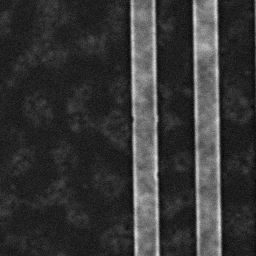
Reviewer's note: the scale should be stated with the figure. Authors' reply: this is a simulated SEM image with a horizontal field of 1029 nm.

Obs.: one or a few lines or trenches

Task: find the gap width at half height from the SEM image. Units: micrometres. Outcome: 0.159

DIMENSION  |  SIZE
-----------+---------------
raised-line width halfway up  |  0.0905 micrometres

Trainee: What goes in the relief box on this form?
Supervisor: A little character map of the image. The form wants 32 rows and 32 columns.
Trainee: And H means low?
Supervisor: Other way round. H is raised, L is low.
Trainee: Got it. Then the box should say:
LLLLLLLLLLLLLLLLLHHLLLLLHHHLLLLL
LLLLLLLLLLLLLLLLLHHLLLLLHHHLLLLL
LLLLLLLLLLLLLLLLLHHLLLLLHHHLLLLL
LLLLLLLLLLLLLLLLLHHLLLLLHHHLLLLL
LLLLLLLLLLLLLLLLLHHLLLLLHHHLLLLL
LLLLLLLLLLLLLLLLLHHLLLLLHHHLLLLL
LLLLLLLLLLLLLLLLLHHLLLLLHHHLLLLL
LLLLLLLLLLLLLLLLLHHLLLLLHHHLLLLL
LLLLLLLLLLLLLLLLLHHLLLLLHHHLLLLL
LLLLLLLLLLLLLLLLLHHLLLLLHHHLLLLL
LLLLLLLLLLLLLLLLLHHLLLLLHHHLLLLL
LLLLLLLLLLLLLLLLLHHLLLLLHHHLLLLL
LLLLLLLLLLLLLLLLLHHLLLLLHHHLLLLL
LLLLLLLLLLLLLLLLLHHLLLLLHHHLLLLL
LLLLLLLLLLLLLLLLLHHHLLLLHHHLLLLL
LLLLLLLLLLLLLLLLLHHHLLLLHHHLLLLL
LLLLLLLLLLLLLLLLLHHLLLLLLHHLLLLL
LLLLLLLLLLLLLLLLLHHLLLLLLHHLLLLL
LLLLLLLLLLLLLLLLLHHLLLLLLHHLLLLL
LLLLLLLLLLLLLLLLLHHLLLLLLHHLLLLL
LLLLLLLLLLLLLLLLLHHHLLLLLHHLLLLL
LLLLLLLLLLLLLLLLLHHHLLLLLHHLLLLL
LLLLLLLLLLLLLLLLLHHHLLLLLHHLLLLL
LLLLLLLLLLLLLLLLLHHHLLLLLHHLLLLL
LLLLLLLLLLLLLLLLLHHHLLLLLHHLLLLL
LLLLLLLLLLLLLLLLLHHHLLLLLHHLLLLL
LLLLLLLLLLLLLLLLLHHHLLLLLHHLLLLL
LLLLLLLLLLLLLLLLLHHHLLLLLHHLLLLL
LLLLLLLLLLLLLLLLLHHHLLLLLHHHLLLL
LLLLLLLLLLLLLLLLLHHHLLLLLHHHLLLL
LLLLLLLLLLLLLLLLLHHHLLLLLHHHLLLL
LLLLLLLLLLLLLLLLLHHHLLLLLHHHLLLL